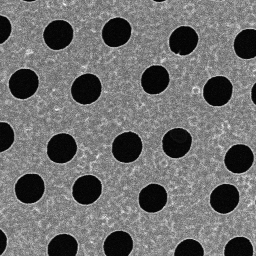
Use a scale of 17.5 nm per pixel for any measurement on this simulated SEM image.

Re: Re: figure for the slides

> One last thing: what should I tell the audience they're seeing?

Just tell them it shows a regular array of holes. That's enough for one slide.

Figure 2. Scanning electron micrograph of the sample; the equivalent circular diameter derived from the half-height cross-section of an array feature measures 527 nm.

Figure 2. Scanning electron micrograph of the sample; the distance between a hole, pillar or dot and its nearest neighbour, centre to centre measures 0.872 µm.